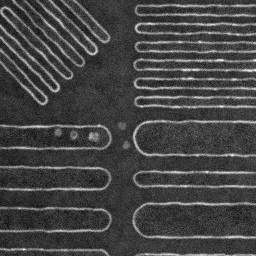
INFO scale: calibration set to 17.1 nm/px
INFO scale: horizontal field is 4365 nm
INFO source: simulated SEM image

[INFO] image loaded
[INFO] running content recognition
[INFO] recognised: groups of lines, slits or small figures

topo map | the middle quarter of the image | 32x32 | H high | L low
LLLLLLLLLLLLLLLLLLHHHHHHHHHHHHHH
HLLLLLLLLLLLLLLLLLLLLLLLLLLLLLLL
HHLLLLLLLLLLLLLLLLLLLLLLLLLLLLLL
HHLLLLLLLLLLLLLLLLLLLLLLLLLLLLLL
LLLLLLLLLLLLLLLLLLHHHHHHHHHHHHHH
LLLLLLLLLLLLLLLLLLHHHHHHHHHHHHHH
LLLLLLLLLLLLLLLLLLLLLLLLLLLLLLLL
LLLLLLLLLLLLLLLLLLLLLLLLLLLLLLLL
LLLLLLLLLLLLLLLLLLHHHHHHHHHLHHHH
LLLLLLLLLLLLLLLLLLHHHHHHHHHHHHHH
LLLLLLLLLLLLLLLLLLHHHLLLHHHHHHHH
LLLLLLLLLLLLLLLLLLLLLLLLLLLLLLLL
LLLLLLLLLLLLLLLLLLLLLLLLLLLLLLLL
LLLLLLLLLLLLLLLLLLLLLLLLLLLLLLLL
LLLLLLLLLLLLLLLLLLLLLLHHHHHLLLHH
LLLLLLLLLLLLLLLLLLLHHHHHHHHHHHHH
HHHHHHHHHHHLLLLLLLHHHHHHHHHHHHHH
HHHHHHHHHHHLLLLLLLHHHHHHHHHHHHHH
HHHHHHHHHHHHLLLLLLHHHHHHHHHHHHHH
HHHHHHHHHHHLLLLLLLHHHHHHHHHHHHHH
HHHHHHHHHHHLLLLLLLHHHHHHHHHHHHHH
LLLLLLLLLLLLLLLLLLLHHHHHHHHHHHHH
LLLLLLLLLLLLLLLLLLLLHHHHHHHHHHHH
LLLLLLLLLLLLLLLLLLLLLLLLLLLLLLLL
LLLLLLLLLLLLLLLLLLLLLLLLLLLLLLLL
LLLLLLLLLLLLLLLLLLLLLLLLLLLLLLLL
HHHHHHHHHHLLLLLLLLLLLLLLLLLLLLLL
HHHHHHHHHHHLLLLLLLHHHHHHHHHHHHHH
HHHHHHHHHHHLLLLLLLHHHHHHHHHHHHHH
HHHHHHHHHHHLLLLLLLHHHHHHHHHHHHHH
HHHHHHHHHHHLLLLLLLLHHLLLLLLLLLLL
LLLLLLLLLLLLLLLLLLLLLLLLLLLLLLLL